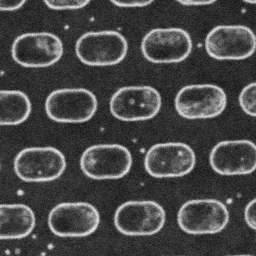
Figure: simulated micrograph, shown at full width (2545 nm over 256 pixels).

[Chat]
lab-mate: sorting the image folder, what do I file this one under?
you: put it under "a regular array of raised bodies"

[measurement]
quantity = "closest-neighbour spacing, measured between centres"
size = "640 nm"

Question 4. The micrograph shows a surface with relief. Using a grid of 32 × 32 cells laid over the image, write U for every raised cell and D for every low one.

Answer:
UUUDDDUUUUDDDDDUUUDDDDDDDDDDDDDD
DDDDDDDDDDDDDDDDDDDDDDDDDDDDDDDD
DDDDDDDDDDDDDDDDDDDDDDDDDDDDDDDD
DDDDDDDDDDDDDDDDDDDDDDDDDDDDUUDD
DDDUUUDDDDDUUUUDDDUUUUUDDDUUUUUU
DDUUUUUDDDUUUUUUDDUUUUUUDDUUUUUU
DDUUUUUUDDUUUUUUDDUUUUUUDDUUUUUD
DDUUUUUDDDUUUUUDDDDUUUDDDDDDDDDD
DDDDDDDDDDDDDDDDDDDDDDDDDDDDDDDD
DDDDDDDDDDDDDDDDDDDDDDDDDDDDDDDD
DDDDDDDDDDDDDDDDDDDDDDDDDDDDDDDD
DDDDDDDUUUUDDDDUUUUDDDDUUUUUDDUU
UUUDDDUUUUUUDDUUUUUUDDUUUUUUDDUU
UUUUDDUUUUUUDDUUUUUUDDUUUUUUDDDU
UUUDDDUUUUUDDDDUUUUDDDDUUUDDDDDD
DDDDDDDDDDDDDDDDDDDDDDDDDDDDDDDD
DDDDDDDDDDDDDDDDDDDDDDDDDDDDDDDD
DDDDDDDDDDDDDDDDDDDDDDDDDDDDDDDD
DDDDDDDDDDDDUUUDDDDUUUUDDDDUUUUU
DDUUUUUUDDUUUUUUDDUUUUUUDDUUUUUU
DDUUUUUUDDUUUUUUDDUUUUUUDDDUUUUU
DDUUUUUUDDDUUUUUDDDUUUUDDDDDUUUD
DDDDDDDDDDDDDDDDDDDDDDDDDDDDDDDD
DDDDDDDDDDDDDDDDDDDDDDDDDDDDDDDD
DDDDDDDDDDDDDDDDDDDDDDDDDDDDDDDD
DDDDDDDDDDDDDDDDUUUDDDDUUUUDDDDU
UUUUDDDUUUUUDDDUUUUUDDDUUUUUDDDU
UUUUDDUUUUUUDDUUUUUUDDDUUUUUDDDU
UUUUDDUUUUUUDDDUUUUUDDDUUUUUDDDD
UUUDDDDDDDDDDDDDDDDDDDDDDDDDDDDD
DDDDDDDDDDDDDDDDDDDDDDDDDDDDDDDD
DDDDDDDDDDDDDDDDDDDDDDDDDDDDDDDD